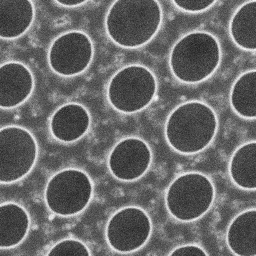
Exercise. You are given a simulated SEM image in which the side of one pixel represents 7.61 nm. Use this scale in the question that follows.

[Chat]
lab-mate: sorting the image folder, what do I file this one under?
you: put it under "a regular array of holes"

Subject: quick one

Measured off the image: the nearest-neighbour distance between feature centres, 526 nanometres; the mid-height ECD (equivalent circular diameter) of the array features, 346 nanometres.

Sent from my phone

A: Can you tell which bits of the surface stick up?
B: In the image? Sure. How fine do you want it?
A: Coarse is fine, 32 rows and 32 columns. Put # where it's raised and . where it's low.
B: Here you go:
....####..####......##....#####.
....##########......##########..
....#########.......#########...
...##########.......#########...
..######...###.....####...###...
#######....####...####.....###..
######.....###########.....#####
######.....##########......#####
...####....#####..####.....#####
....##########.....###....####..
....##########.....##########...
....##########.....##########...
...###########.....##########...
########..#####...####....###...
#######....##########......###..
######.....##########......#####
...####....##########......#####
....####.#######.####.....######
....##########....####...#####..
....##########.....##########...
....##########.....##########...
...#####..####....###########...
..####.....###########....###...
######.....##########......####.
######.....##########......#####
#.####.....##########.....######
...####...#####...###.....#####.
....##########.....####.#####...
...##########......##########...
...##########......#########....
..#####...####....###########...
######.....###########...####...